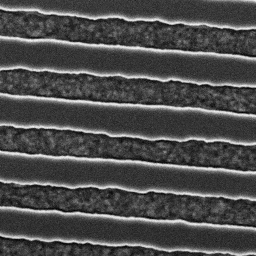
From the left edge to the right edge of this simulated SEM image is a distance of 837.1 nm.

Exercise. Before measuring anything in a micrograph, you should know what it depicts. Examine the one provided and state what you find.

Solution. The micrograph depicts lines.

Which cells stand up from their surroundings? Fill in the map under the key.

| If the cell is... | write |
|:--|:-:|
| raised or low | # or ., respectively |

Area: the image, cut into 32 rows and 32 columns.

################################
.....###########################
................#.##############
............................####
................................
###########.....................
########################........
################################
##.#############################
............####################
..........................######
................................
#########.......................
######################..........
################################
################################
...........#####################
......................##.#######
................................
######..........................
####################............
################################
################################
............#..#################
.........................#######
................................
#######.........................
####################............
###############################.
################################
............####################
.........................#######